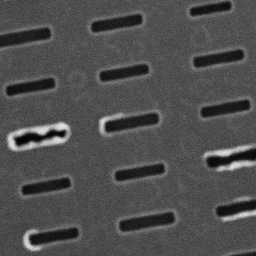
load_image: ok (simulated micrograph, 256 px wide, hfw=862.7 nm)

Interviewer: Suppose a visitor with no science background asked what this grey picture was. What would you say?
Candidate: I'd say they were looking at a regular array of holes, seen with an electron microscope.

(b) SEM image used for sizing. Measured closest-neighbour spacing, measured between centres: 50.2 pixels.